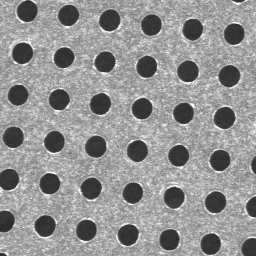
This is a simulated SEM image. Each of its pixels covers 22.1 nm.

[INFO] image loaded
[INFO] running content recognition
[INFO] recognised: a regular array of holes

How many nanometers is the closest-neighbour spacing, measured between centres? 919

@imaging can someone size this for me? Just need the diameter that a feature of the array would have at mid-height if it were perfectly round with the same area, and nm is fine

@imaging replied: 477